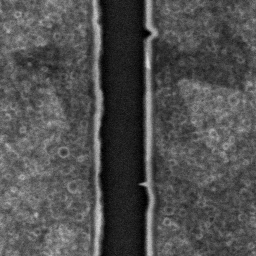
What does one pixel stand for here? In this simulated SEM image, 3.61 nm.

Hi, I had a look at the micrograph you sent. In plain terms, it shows one or a few lines or trenches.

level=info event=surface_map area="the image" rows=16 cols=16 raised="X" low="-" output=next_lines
XXXXXX---XXXXXXX
XXXXXX---XXXXXXX
XXXXXX---XXXXXXX
XXXXXX---XXXXXXX
XXXXXX---XXXXXXX
XXXXXX---XXXXXXX
XXXXXX---XXXXXXX
XXXXXX---XXXXXXX
XXXXXX---XXXXXXX
XXXXXX---XXXXXXX
XXXXXX---XXXXXXX
XXXXXX---XXXXXXX
XXXXXX---XXXXXXX
XXXXXX---XXXXXXX
XXXXXX---XXXXXXX
XXXXXX---XXXXXXX